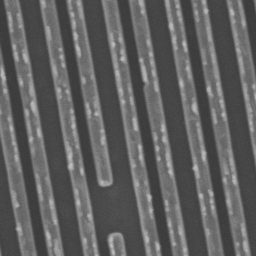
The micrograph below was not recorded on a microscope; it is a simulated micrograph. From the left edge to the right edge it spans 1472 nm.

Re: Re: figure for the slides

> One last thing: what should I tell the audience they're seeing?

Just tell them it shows parallel lines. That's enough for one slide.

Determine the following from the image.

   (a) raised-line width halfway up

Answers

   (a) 0.0806 um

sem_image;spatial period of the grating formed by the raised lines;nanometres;177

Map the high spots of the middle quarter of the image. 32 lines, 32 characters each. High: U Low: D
DDDDUUUDDDDDDUUUDDDUUUUDDDDDUUUD
UDDDUUUDDDDDDUUUDDDUUUUDDDDDUUUU
UDDDUUUDDDDDDUUUDDDUUUUDDDDDDUUU
UDDDUUUUDDDDDUUUDDDDUUUDDDDDDUUU
UDDDUUUUDDDDDUUUUDDDUUUDDDDDDUUU
UDDDUUUUDDDDDDUUUDDDUUUDDDDDDUUU
UDDDDUUUDDDDDDUUUDDDUUUUDDDDDUUU
UUDDDUUUDDDDDDUUUDDDUUUUDDDDDUUU
UUDDDUUUDDDDDDUUUDDDDUUUDDDDDDUU
UUDDDUUUUDDDDDUUUDDDDUUUDDDDDDUU
UUDDDUUUUDDDDDUUUUDDDUUUDDDDDDUU
UUDDDDUUUDDDDDDUUUDDDUUUUDDDDDUU
UUDDDDUUUDDDDDDUUUDDDUUUUDDDDDUU
UUUDDDUUUDDDDDDUUUDDDUUUUDDDDDUU
UUUDDDUUUUDDDDDUUUDDDDUUUDDDDDDU
UUUDDDUUUUDDDDDUUUUDDDUUUDDDDDDU
UUUDDDUUUUDDDDDUUUUDDDUUUDDDDDDU
UUUDDDDUUUDDDDDDUUUDDDUUUUDDDDDU
UUUUDDDUUUDDDDDDUUUDDDUUUUDDDDDU
UUUUDDDUUUDDDDDDUUUDDDUUUUDDDDDD
UUUUDDDUUUDDDDDDUUUDDDDUUUDDDDDD
DUUUDDDUUUDDDDDDUUUUDDDUUUDDDDDD
DUUUDDDUUUUDDDDDUUUUDDDUUUDDDDDD
DUUUDDDDUUUDDDDDDUUUDDDUUUUDDDDD
DUUUUDDDUUUDDDDDDUUUDDDUUUUDDDDD
DUUUUDDDUUUDDDDDDUUUDDDUUUUDDDDD
DUUUUDDDUUUDDDDDDUUUDDDDUUUDDDDD
DDUUUDDDUUUUDDDDDUUUUDDDUUUDDDDD
DDUUUDDDUUUUDDDDDUUUUDDDUUUDDDDD
DDUUUDDDDUUUDDDDDDUUUDDDUUUUDDDD
DDUUUUDDDDDDDDDDDDUUUDDDUUUUDDDD
DDDUUUDDDDDDDDDDDDUUUDDDDUUUDDDD